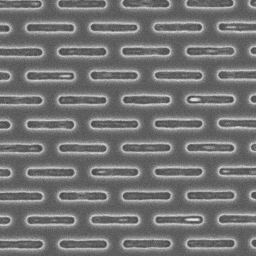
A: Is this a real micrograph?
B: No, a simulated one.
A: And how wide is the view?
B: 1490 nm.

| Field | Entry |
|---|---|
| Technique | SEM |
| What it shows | a regular array of holes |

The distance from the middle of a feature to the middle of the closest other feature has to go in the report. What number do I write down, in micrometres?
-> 0.229